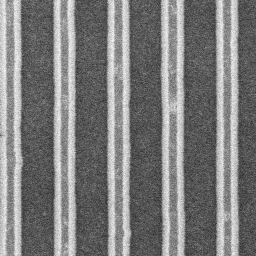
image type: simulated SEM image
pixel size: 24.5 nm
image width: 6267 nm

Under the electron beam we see parallel lines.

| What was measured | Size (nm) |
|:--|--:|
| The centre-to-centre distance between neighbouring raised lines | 1330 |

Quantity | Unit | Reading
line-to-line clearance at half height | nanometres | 955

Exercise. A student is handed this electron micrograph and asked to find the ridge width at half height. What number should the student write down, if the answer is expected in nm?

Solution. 373